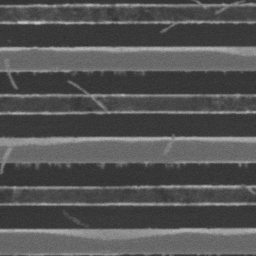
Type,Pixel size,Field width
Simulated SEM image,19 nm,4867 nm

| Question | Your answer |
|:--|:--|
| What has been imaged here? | lines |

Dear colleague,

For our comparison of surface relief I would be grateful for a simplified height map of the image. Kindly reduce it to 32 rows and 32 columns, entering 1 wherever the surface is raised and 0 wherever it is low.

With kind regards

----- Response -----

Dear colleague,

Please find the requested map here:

00000000000000000000000011001100
11111111111111111111111111111111
11111111111111111111111111111111
00000000000000000000000000000000
00000000000000000000000000000000
00000000000000000000000000000000
11111111111111111111111111111111
11111111111111111111111111111111
11111111111111111111111111111111
00000000000000000000000000000000
00000000000000000000000000000000
00000000000000000000000000000000
11111111111111111111111111111111
11111111111111111111111111111111
00000000000000000000000000000000
00000000000000000000000000000000
00000000000000000000000000000000
00000000011111111111111111111111
11111111111111111111111111111111
11111111111111111111111111111111
10000000000000000000000000000000
00000000000000000000000000000000
00000000000000000000000000000000
11111111111111111111111111111111
11111111111111111111111111111111
11111111111111000000000000000000
00000000000000000000000000000000
00000000000000000000000000000000
00000000000000000000000000000000
11111111111111111111111111111111
11111111111111111111111111111111
11111111111111111111111111111111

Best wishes